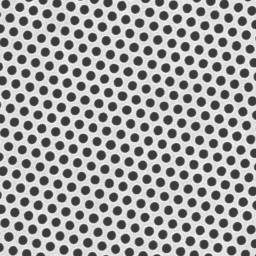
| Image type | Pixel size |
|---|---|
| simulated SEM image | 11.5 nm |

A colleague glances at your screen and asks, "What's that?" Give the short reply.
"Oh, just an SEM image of a regular array of holes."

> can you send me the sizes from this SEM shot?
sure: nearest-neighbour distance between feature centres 14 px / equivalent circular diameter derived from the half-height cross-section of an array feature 112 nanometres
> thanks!